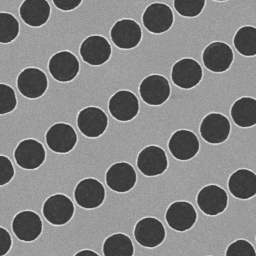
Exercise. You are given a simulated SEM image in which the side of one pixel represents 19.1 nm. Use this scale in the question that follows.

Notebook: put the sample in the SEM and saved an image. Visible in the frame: a regular array of holes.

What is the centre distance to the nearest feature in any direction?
669 nm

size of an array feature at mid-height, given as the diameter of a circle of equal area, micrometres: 0.579